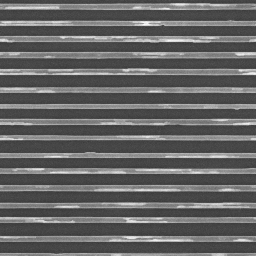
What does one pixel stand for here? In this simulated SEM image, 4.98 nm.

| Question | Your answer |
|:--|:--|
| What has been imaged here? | parallel lines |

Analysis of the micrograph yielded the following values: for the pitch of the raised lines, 82.8 nanometres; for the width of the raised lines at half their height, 0.0274 microns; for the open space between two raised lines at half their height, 11.1 px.